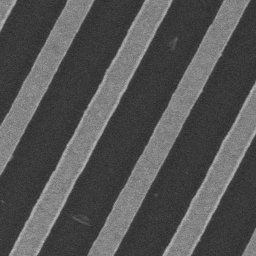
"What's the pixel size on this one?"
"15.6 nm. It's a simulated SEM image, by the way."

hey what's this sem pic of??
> lines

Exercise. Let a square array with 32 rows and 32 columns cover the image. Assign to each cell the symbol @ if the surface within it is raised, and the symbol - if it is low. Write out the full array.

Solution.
@@------@@@@------@@@-------@@@-
@-------@@@------@@@@------@@@--
@------@@@-------@@@-------@@@--
-------@@@------@@@@------@@@---
------@@@-------@@@-------@@@---
------@@@------@@@@------@@@----
-----@@@-------@@@-------@@@----
-----@@@------@@@@------@@@-----
----@@@-------@@@------@@@@-----
---@@@@------@@@@------@@@------
---@@@-------@@@------@@@@------
--@@@@------@@@-------@@@------@
--@@@-------@@@------@@@@------@
-@@@@------@@@-------@@@------@@
-@@@------@@@@------@@@-------@@
@@@-------@@@-------@@@------@@@
@@@------@@@@------@@@-------@@@
@@-------@@@-------@@@------@@@-
@@------@@@@------@@@-------@@@-
@-------@@@-------@@@------@@@--
@------@@@@------@@@------@@@@--
-------@@@-------@@@------@@@---
------@@@-------@@@-------@@@---
------@@@-------@@@------@@@----
-----@@@-------@@@------@@@@----
----@@@@------@@@@------@@@-----
----@@@@------@@@------@@@@-----
---@@@@------@@@@------@@@------
---@@@-------@@@------@@@@------
--@@@@------@@@-------@@@-------
--@@@-------@@@------@@@@------@
-@@@@------@@@-------@@@-------@